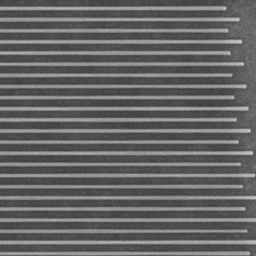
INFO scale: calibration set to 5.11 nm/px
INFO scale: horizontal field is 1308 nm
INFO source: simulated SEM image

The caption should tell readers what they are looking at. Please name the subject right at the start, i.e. parallel lines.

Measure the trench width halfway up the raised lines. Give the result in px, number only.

8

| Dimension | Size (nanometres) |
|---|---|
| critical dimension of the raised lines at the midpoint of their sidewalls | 13.4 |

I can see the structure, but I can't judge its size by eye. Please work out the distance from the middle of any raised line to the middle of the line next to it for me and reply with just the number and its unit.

0.057 µm